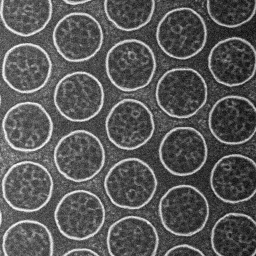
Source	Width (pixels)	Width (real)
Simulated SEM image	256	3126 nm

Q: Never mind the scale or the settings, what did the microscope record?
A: a regular array of raised bodies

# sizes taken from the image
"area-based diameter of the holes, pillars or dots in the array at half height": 48.9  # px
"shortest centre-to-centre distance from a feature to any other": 717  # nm